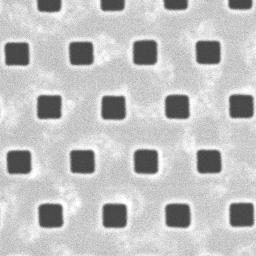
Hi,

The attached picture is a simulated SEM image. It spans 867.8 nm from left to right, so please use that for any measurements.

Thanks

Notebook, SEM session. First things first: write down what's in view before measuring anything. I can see a regular array of holes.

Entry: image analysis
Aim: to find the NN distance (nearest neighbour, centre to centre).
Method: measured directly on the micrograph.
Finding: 212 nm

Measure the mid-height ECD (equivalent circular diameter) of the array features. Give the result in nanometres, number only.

92.5